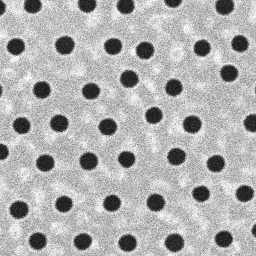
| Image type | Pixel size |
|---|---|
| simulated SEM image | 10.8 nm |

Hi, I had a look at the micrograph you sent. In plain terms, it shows a regular array of holes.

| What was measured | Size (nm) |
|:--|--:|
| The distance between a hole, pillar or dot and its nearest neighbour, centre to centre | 404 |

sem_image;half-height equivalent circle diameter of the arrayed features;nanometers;200